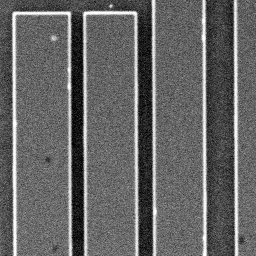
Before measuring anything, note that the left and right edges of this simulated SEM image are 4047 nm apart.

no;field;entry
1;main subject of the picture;groups of lines, slits or small figures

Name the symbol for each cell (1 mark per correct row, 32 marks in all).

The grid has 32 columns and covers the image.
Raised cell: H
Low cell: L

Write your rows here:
LLLLLLLLLLLLLLLLLLLHHHHHHLLLLHHH
LLLLLLLLLLLLLLLLLLLHHHHHHHLLLHHH
LLHHHHHHHLLHHHHHHLLHHHHHHHLLLHHH
LLHHHHHHHLLHHHHHHLLHHHHHHHLLLHHH
LLHHHHHHHLLHHHHHHLLHHHHHHHLLLHHH
LLHHHHHHHLLHHHHHHLLHHHHHHHLLLHHH
LLHHHHHHHLLHHHHHHLLHHHHHHHLLLHHH
LLHHHHHHHLLHHHHHHLLHHHHHHHLLLHHH
LLHHHHHHHLLHHHHHHLLHHHHHHHLLLHHH
LLHHHHHHHLLHHHHHHLLHHHHHHHLLLHHH
LLHHHHHHHLLHHHHHHLLHHHHHHHLLLHHH
LLHHHHHHHLLHHHHHHLLHHHHHHHLLLHHH
LLHHHHHHHLLHHHHHHLLHHHHHHHLLLHHH
LLHHHHHHHLLHHHHHHLLHHHHHHHLLLLHH
LLHHHHHHHLLHHHHHHLLHHHHHHHLLLLHH
LLHHHHHHHLLHHHHHHLLHHHHHHHLLLLHH
LLHHHHHHHLLHHHHHHLLHHHHHHHLLLLHH
LLHHHHHHHLLHHHHHHLLHHHHHHHLLLLHH
LLHHHHHHHLLHHHHHHLLHHHHHHHLLLLHH
LLHHHHHHHLLHHHHHHLLHHHHHHHLLLLHH
LLHHHHHHHLLHHHHHHLLHHHHHHHLLLLHH
LLHHHHHHHLLHHHHHHLLHHHHHHHLLLLHH
LLHHHHHHHLLHHHHHHLLHHHHHHHLLLLHH
LLHHHHHHHLLHHHHHHLLHHHHHHHLLLLHH
LLHHHHHHHLLHHHHHHLLHHHHHHHLLLLHH
LLHHHHHHHLLHHHHHHLLHHHHHHHLLLLHH
LLHHHHHHHLLHHHHHHLLHHHHHHHLLLLHH
LLHHHHHHHLLHHHHHHLLHHHHHHHLLLLHH
LLHHHHHHHLLHHHHHHLLHHHHHHHLLLLHH
LLHHHHHHHLLHHHHHHLLHHHHHHHLLLLHH
LLHHHHHHHLLHHHHHHLLHHHHHHHLLLLHH
LLHHHHHHHLLHHHHHHLLHHHHHHHLLLLHH